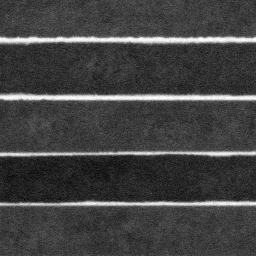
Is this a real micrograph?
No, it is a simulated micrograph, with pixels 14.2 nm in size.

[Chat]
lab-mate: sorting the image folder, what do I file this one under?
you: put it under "lines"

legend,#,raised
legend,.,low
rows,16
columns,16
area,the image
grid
################
################
................
................
................
................
################
################
################
################
................
................
................
################
################
################